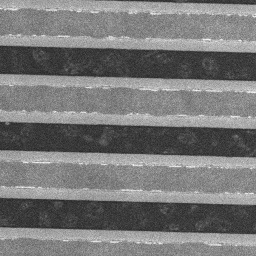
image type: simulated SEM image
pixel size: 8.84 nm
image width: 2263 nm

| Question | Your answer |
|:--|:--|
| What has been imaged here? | one or a few lines or trenches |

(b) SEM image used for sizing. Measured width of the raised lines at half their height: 325 nm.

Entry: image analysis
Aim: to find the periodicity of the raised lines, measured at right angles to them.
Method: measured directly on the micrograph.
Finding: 0.674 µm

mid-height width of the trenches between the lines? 0.354 micrometres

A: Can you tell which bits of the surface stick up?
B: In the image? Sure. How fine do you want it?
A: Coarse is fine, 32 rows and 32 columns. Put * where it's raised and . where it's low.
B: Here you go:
...*............................
********************************
********************************
********************************
********************************
..................*...**********
................................
................................
................................
................................
*****************...............
********************************
********************************
********************************
..******************************
................................
................................
................................
................................
................................
********************************
********************************
********************************
********************************
..................**************
................................
................................
................................
................................
************....................
********************************
********************************